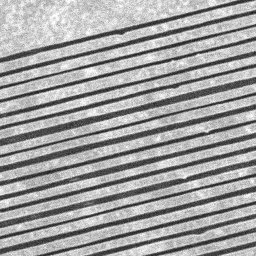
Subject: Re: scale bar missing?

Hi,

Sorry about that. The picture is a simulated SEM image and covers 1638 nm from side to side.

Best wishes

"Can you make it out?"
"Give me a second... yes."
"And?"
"parallel lines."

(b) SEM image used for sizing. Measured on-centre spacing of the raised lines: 84.8 nanometres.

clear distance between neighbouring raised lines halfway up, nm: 31.1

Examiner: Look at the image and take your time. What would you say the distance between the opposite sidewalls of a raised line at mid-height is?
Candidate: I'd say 56.7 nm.